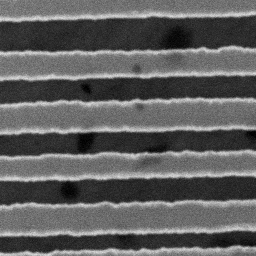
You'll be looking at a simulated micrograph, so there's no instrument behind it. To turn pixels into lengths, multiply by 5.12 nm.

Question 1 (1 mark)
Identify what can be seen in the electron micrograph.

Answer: lines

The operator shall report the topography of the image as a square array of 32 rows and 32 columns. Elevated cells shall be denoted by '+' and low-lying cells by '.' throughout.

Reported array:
++++++++++++++++++++++++++++++++
++++++++++++++++++++++++++++++++
+.+.............................
................................
................................
................................
...+.....+..+++..+++++++++++++++
++++++++++++++++++++++++++++++++
++++++++++++++++++++++++++++++++
++++++++++++++....+.............
................................
................................
...................+.+++++++++++
++++++++++++++++++++++++++++++++
++++++++++++++++++++++++++++++++
++++++++++++++++++++++++++++++++
+++..+.+........................
................................
................................
.....+++++++++++++++++++++++++++
++++++++++++++++++++++++++++++++
++++++++++++++++++++++++++++++++
................................
................................
................................
...++.....+.++.+++++++++++++++++
++++++++++++++++++++++++++++++++
++++++++++++++++++++++++++++++++
++++++++++++++++++++++++++++++++
................................
................................
.......+++++++++++++++++++++++++